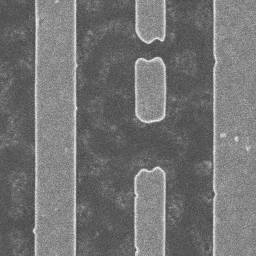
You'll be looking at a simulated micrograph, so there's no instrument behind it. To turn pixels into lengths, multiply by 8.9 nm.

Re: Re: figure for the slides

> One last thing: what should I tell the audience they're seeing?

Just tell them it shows one or a few lines or trenches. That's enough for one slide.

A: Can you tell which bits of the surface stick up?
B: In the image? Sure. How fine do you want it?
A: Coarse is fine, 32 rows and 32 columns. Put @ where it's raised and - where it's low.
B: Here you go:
----@@@@@--------@@@@------@@@@@
----@@@@@--------@@@@------@@@@@
-----@@@@--------@@@@------@@@@@
-----@@@@--------@@@@------@@@@@
-----@@@@--------@@@@------@@@@@
-----@@@@------------------@@@@@
-----@@@@------------------@@@@@
----@@@@@@-------@@@-------@@@@@
----@@@@@@-------@@@@------@@@@@
----@@@@@--------@@@@------@@@@@
----@@@@@--------@@@@------@@@@@
----@@@@@--------@@@@------@@@@@
----@@@@@--------@@@@------@@@@@
----@@@@@@-------@@@@------@@@@@
----@@@@@--------@@@@------@@@@@
----@@@@@------------------@@@@@
----@@@@@------------------@@@@@
----@@@@@------------------@@@@@
-----@@@@------------------@@@@@
-----@@@@------------------@@@@@
-----@@@@----------------@@@@@@@
-----@@@@--------@@@-----@-@@@@@
-----@@@@--------@@@@------@@@@@
----@@@@@--------@@@@------@@@@@
----@@@@@--------@@@@------@@@@@
----@@@@@--------@@@@------@@@@@
----@@@@@--------@@@@------@@@@@
----@@@@@--------@@@@------@@@@@
----@@@@@--------@@@@------@@@@@
----@@@@@--------@@@@------@@@@@
----@@@@@--------@@@@------@@@@@
----@@@@@--------@@@@------@@@@@